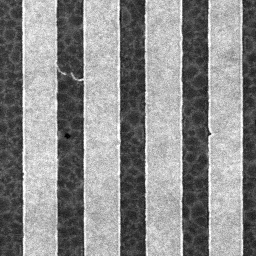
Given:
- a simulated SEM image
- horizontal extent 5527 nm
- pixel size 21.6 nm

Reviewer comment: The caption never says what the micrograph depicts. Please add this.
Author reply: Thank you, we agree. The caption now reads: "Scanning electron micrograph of one or a few lines or trenches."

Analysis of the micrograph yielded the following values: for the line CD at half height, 749 nanometres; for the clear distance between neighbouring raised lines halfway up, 0.583 µm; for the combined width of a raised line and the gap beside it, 1340 nanometers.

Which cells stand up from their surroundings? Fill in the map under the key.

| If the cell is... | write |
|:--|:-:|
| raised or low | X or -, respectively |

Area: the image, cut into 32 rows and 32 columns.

---XXXX---XXXXX---XXXXX---XXXX--
---XXXX---XXXXX---XXXXX---XXXX--
---XXXX----XXXXX--XXXXX---XXXX--
---XXXX---XXXXX---XXXXX---XXXX--
---XXXX---XXXXX---XXXXX---XXXX--
---XXXX----XXXX---XXXXX---XXXX--
---XXXX----XXXX---XXXXX---XXXX--
---XXXX----XXXX---XXXXX---XXXX--
---XXXX----XXXX---XXXXX---XXXX--
---XXXX---XXXXX---XXXXX---XXXX--
---XXXX---XXXXX---XXXXX---XXXX--
---XXXX----XXXX---XXXXX---XXXX--
---XXXX----XXXX---XXXXX---XXXX--
---XXXX----XXXX---XXXXX---XXXX--
---XXXX----XXXX---XXXXX---XXXX--
---XXXX----XXXX---XXXXX---XXXX--
---XXXX----XXXX---XXXXX---XXXX--
---XXXX----XXXX---XXXXX---XXXX--
---XXXX----XXXX---XXXXX---XXXX--
---XXXX----XXXX---XXXXX---XXXX--
---XXXX----XXXX---XXXXX---XXXX--
---XXXX----XXXX---XXXXX---XXXX--
---XXXX----XXXX---XXXXX---XXXX--
---XXXX----XXXX---XXXXX---XXXX--
---XXXX----XXXX---XXXXX---XXXX--
---XXXX----XXXX---XXXXX---XXXX--
---XXXX----XXXX---XXXXX---XXXX--
---XXXX----XXXX---XXXXX---XXXX--
---XXXX----XXXX---XXXXX---XXXX--
---XXXX----XXXX---XXXXX---XXXX--
---XXXX----XXXX---XXXXX---XXXX--
---XXXX----XXXX---XXXXX---XXXX--